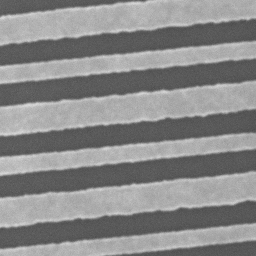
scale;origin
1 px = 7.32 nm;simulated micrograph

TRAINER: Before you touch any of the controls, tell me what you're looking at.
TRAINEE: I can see lines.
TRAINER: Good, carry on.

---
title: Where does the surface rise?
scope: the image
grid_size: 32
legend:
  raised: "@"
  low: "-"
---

--------------@@@@@@@@@@@@@@@@@@
------@@@@@@@@@@@@@@@@@@@@@@@@@@
@@@@@@@@@@@@@@@@@@@@@@@@@@@@@---
@@@@@@@@@@@@@@@@@@@@------------
@@@@@@@@@@----------------------
@----------------------------@@@
------------------@@@@@@@@@@@@@@
---------@@@@@@@@@@@@@@@@@@@----
@@@@@@@@@@@@@@@@@@@-------------
@@@@@@@@@-----------------------
-----------------------------@@@
-------------------@@@@@@@@@@@@@
----------@@@@@@@@@@@@@@@@@@@@@@
@@@@@@@@@@@@@@@@@@@@@@@@@@@@@@@@
@@@@@@@@@@@@@@@@@@@@@@@@--------
@@@@@@@@@@@@@@------------------
@@@@@---------------------------
-----------------------@@@@@@@@@
-------------@@@@@@@@@@@@@@@@@@@
--@@@@@@@@@@@@@@@@@@@@@---------
@@@@@@@@@@@@@-------------------
@@@----------------------------@
----------------------@@@@@@@@@@
-------------@@@@@@@@@@@@@@@@@@@
---@@@@@@@@@@@@@@@@@@@@@@@@@@@@@
@@@@@@@@@@@@@@@@@@@@@@@@@@@@@---
@@@@@@@@@@@@@@@@@@--------------
@@@@@@@@------------------------
---------------------------@@@@@
-----------------@@@@@@@@@@@@@@@
------@@@@@@@@@@@@@@@@@@@@------
@@@@@@@@@@@@@@@@@@--------------